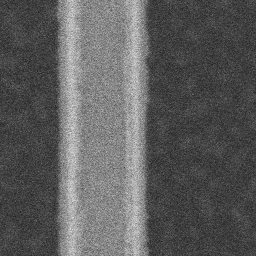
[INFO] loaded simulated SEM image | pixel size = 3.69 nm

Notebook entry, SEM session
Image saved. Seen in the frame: one or a few lines or trenches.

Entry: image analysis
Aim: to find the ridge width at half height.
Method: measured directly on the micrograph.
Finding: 0.228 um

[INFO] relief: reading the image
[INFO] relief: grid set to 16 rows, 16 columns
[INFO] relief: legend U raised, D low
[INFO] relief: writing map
DDDDDUUUDDDDDDDD
DDDDDUUUDDDDDDDD
DDDDDUUUDDDDDDDD
DDDDDUUUDDDDDDDD
DDDDDUUUDDDDDDDD
DDDDDUUUDDDDDDDD
DDDDDUUUDDDDDDDD
DDDDDUUUDDDDDDDD
DDDDDUUUDDDDDDDD
DDDDDUUUDDDDDDDD
DDDDDUUUDDDDDDDD
DDDDDUUUDDDDDDDD
DDDDDUUUDDDDDDDD
DDDDDUUUDDDDDDDD
DDDDDUUUDDDDDDDD
DDDDDUUUDDDDDDDD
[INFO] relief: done